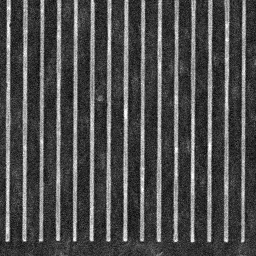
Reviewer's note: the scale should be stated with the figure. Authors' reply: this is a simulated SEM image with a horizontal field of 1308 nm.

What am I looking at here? parallel lines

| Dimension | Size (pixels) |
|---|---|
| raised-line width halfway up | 2.62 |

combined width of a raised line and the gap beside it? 85.9 nm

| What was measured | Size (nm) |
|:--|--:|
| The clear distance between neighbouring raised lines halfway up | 70.3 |